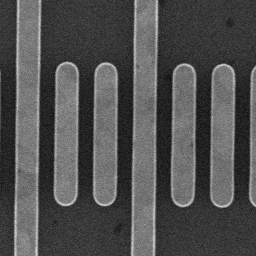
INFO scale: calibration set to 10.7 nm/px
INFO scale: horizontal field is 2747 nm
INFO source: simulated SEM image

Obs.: groups of lines, slits or small figures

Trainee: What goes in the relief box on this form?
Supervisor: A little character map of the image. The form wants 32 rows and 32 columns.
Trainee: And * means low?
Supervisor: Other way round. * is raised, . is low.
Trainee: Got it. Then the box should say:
..***............***............
..***............***............
..***............***............
..***............***............
..***............***............
..***............***............
..***............***............
..***............***............
..***..***..**...***..**...**...
..***..***..***..**...**...**...
..***..***..***..**...**...**...
..***..***..***..**...**...**..*
..***..***..***..**...**..***..*
..***..***..***..**...**..***..*
..***..***..***..**...**..***..*
..***..***..***..**...**..***..*
..***..***..***..**...**..***..*
..***..***..***..**...**..***..*
..***..***..***..**...**..***..*
..***..***..***..**..***..***..*
..***..***..***..**..***..***..*
..***..***..***..**..***..***..*
..***..***..***..**..***..***..*
..***..***..**...**..***..***..*
..***..***..**...**..***..***..*
..***...*....*...**...**...**...
..***............**.............
..***............**.............
..***............**.............
..***............**.............
..***............**.............
..***............**.............